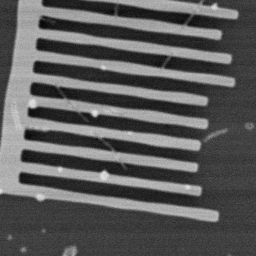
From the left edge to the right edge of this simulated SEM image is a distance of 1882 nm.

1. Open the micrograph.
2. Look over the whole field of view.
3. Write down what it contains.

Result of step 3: groups of lines, slits or small figures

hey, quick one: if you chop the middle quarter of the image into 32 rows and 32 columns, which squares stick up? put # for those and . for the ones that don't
.....###############............
............#############.......
...................#############
#..........................#####
#######.........................
###############.................
.......###############..........
..............#################.
....................############
####.........................###
###########.....................
..#################.............
.......###################......
.................###############
......................##########
#####..........................#
############....................
....###############.............
............#################...
...................#############
#.......................########
#########.......................
###############.................
......##################........
..............################..
.......................#########
###...........................##
###########.....................
..###############...............
.........###############........
.................###############
........................########